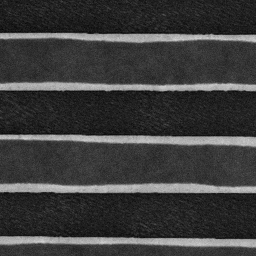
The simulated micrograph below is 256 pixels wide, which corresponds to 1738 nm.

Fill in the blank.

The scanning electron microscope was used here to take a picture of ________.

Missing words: lines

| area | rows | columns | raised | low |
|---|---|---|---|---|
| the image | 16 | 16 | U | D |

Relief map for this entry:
DDDDDDDDDDDDDDDD
DDDDDDDDDDDDDDDD
UUUUUUUUUUUUUUUU
UUUUUUUUUUUUUUUU
UUUUUUUUUUUUUUUU
DDDDDDDDDDUDDDDD
DDDDDDDDDDDDDDDD
DDDDDDDDDDDDDDDD
DDDDDDDDDDDDDDDD
UUUUUUUUUUUUUUUU
UUUUUUUUUUUUUUUU
UUUUUUUUUUUUUUUU
DDDDDDDDDDDDDDDD
DDDDDDDDDDDDDDDD
DDDDDDDDDDDDDDDD
UUUUUUUUUUUUUUUU